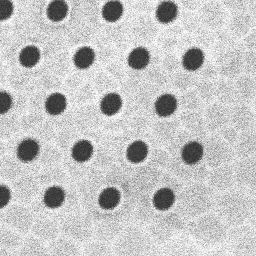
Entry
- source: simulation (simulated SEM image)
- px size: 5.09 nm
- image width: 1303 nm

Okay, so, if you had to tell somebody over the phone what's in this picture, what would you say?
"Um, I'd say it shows a regular array of holes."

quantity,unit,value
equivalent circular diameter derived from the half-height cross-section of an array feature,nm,111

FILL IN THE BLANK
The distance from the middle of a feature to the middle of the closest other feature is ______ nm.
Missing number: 274